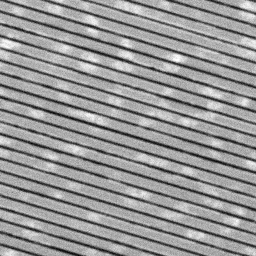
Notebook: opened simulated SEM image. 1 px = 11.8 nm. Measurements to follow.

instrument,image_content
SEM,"parallel lines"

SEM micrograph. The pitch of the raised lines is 11.7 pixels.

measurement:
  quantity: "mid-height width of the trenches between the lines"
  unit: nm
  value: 40.9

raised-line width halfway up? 100 nm